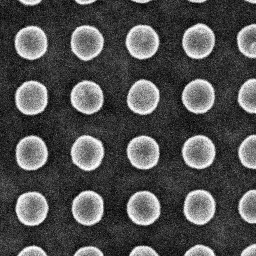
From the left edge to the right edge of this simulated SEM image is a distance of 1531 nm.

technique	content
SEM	a regular array of raised bodies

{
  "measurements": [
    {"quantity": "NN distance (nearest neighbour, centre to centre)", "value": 328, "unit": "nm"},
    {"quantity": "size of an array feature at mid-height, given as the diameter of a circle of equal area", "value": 0.192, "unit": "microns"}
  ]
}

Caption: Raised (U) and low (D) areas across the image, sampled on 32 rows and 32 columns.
DDDDDDDDDDDDDDDDDDDDDDDDDDDDDDDD
DDDDDDDDDDDDDDDDDDDDDDDDDDDDDDDD
DDDDDDDDDDDDDDDDDDDDDDDDDDDDDDDD
DDDUUDDDDDUUDDDDDUUDDDDDUUDDDDDU
DDUUUUDDDUUUUDDDUUUUDDDUUUUDDDUU
DDUUUUDDDUUUUDDDUUUUDDDUUUUDDDUU
DDUUUDDDDUUUDDDDUUUDDDDUUUDDDDUU
DDDDDDDDDDUDDDDDDDDDDDDDDDDDDDDD
DDDDDDDDDDDDDDDDDDDDDDDDDDDDDDDD
DDDDDDDDDDDDDDDDDDDDDDDDDDDDDDDD
DDDUUDDDDDUUDDDDDUUDDDDDUUDDDDDU
DDUUUUDDDUUUUDDDUUUUDDDUUUUDDDUU
DDUUUUDDDUUUUDDDUUUUDDDUUUUDDDUU
DDUUUUDDDDUUDDDDUUUDDDDUUUDDDDUU
DDDDDDDDDDDDDDDDDDDDDDDDDDDDDDDD
DDDDDDDDDDDDDDDDDDDDDDDDDDDDDDDD
DDDDDDDDDDDDDDDDDDDDDDDDDDDDDDDD
DDDUUDDDDDUUDDDDDUUDDDDDUUDDDDDU
DDUUUUDDDUUUUDDDUUUUDDDUUUUDDDUU
DDUUUUDDDUUUUDDDUUUUDDDUUUUDDDUU
DDUUUDDDDDUUDDDDDUUDDDDDUUDDDDDU
DDDDDDDDDDDDDDDDDDDDDDDDDDDDDDDD
DDDDDDDDDDDDDDDDDDDDDDDDDDDDDDDD
DDDDDDDDDDDDDDDDDDDDDDDDDDDDDDDD
DDDUUDDDDDUUDDDDDUUDDDDDUUDDDDDU
DDUUUUDDDUUUUDDDUUUUDDDUUUUDDDUU
DDUUUUDDDUUUUDDDUUUUDDDUUUUDDDUU
DDDUUDDDDDUUDDDDDUUDDDDDUUDDDDDU
DDDDDDDDDDDDDDDDDDDDDDDDDDDDDDDD
DDDDDDDDDDDDDDDDDDDDDDDDDDDDDDDD
DDDDDDDDDDDDDDDDDDDDDDDDDDDDDDDD
DDDUUDDDDDUUUDDDUUUDDDDUUUDDDDUU